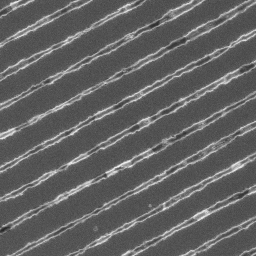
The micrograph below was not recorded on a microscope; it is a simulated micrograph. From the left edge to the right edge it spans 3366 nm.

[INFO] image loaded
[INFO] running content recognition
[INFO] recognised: parallel lines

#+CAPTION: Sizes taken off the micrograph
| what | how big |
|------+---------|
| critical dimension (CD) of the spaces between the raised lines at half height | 300 nanometers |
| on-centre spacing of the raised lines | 360 nanometres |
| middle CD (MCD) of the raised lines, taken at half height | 62.3 nm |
